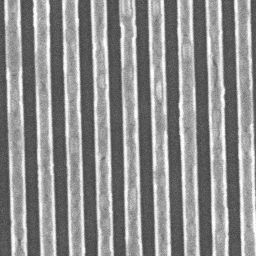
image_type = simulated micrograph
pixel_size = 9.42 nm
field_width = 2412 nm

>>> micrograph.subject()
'parallel lines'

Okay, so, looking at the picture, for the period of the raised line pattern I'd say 28.7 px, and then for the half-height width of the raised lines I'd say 139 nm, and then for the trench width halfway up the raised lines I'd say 132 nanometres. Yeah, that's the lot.